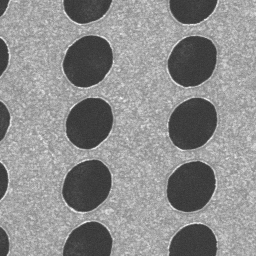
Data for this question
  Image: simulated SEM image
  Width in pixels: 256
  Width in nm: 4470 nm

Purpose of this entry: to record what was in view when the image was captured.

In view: holes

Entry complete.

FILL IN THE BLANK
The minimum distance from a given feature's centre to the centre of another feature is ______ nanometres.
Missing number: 1090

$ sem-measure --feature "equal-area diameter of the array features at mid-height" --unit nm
882